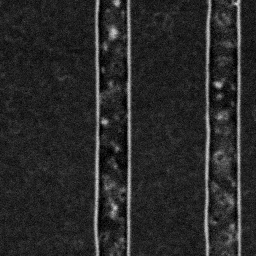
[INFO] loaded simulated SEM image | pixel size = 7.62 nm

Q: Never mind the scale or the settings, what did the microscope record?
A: one or a few lines or trenches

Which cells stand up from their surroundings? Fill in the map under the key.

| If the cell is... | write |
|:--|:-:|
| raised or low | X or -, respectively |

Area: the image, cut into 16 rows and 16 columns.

XXXXXX--XXXXX--X
XXXXXX--XXXXX--X
XXXXXX--XXXXX--X
XXXXXX--XXXXX--X
XXXXXX--XXXXX--X
XXXXXX--XXXXX--X
XXXXXX--XXXXX--X
XXXXXX--XXXXX--X
XXXXXX--XXXXX--X
XXXXXX--XXXXX--X
XXXXXX--XXXXX--X
XXXXXX--XXXXX--X
XXXXXX--XXXXX--X
XXXXXX--XXXXX--X
XXXXXX--XXXXX--X
XXXXXX--XXXXX--X